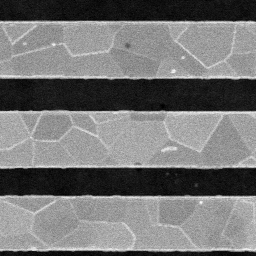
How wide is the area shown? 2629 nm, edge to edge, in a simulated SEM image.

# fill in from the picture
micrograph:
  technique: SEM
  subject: lines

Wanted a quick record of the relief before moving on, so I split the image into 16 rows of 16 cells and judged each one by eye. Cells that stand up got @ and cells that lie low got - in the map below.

----------------
@@@@@@@@@@@@@@@@
@@@@@@@@@@@@@@@@
@@@@@@@@@@@@@@@@
@@@@@@@@@@@@@@@@
----------------
----------------
@@@@@@@@@@@@@@@@
@@@@@@@@@@@@@@@@
@@@@@@@@@@@@@@@@
----------------
----------------
@@@@@@@@@@@@@@@@
@@@@@@@@@@@@@@@@
@@@@@@@@@@@@@@@@
@@@@@@@@@@@@@@@@